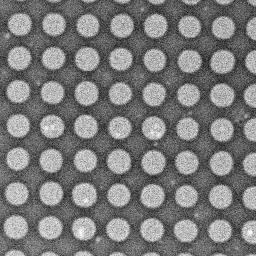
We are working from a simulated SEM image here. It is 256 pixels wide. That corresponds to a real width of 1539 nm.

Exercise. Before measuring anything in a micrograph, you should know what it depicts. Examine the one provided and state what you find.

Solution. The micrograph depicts an array of small figures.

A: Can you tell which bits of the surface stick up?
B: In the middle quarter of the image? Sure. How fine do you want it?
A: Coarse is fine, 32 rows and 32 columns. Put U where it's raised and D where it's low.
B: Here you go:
DDDUUUUUDDDDUUUUDDDDDUUUUDDDDUUU
DDDDDUUDDDDDDDDDDDDDDDUUDDDDDDUU
DDDDDDDDDDDDDDDDDDDDDDDDDDDDDDDD
DDDDDDDDDDDDDDDDDDDDDDDDDDDDDDDD
DDDDDDDDDDDDDDDDDDDDDDDDDDDDDDDD
DDDDUUUUDDDDUUUUDDDDDUUUDDDDDDUU
DDDUUUUUDDDDUUUUUDDDUUUUUDDDDUUU
DDDUUUUUDDDUUUUUUDDDUUUUUDDDDUUU
DDDUUUUUDDDDUUUUDDDDUUUUUDDDDUUU
DDDDUUUUDDDDUUUUDDDDDUUUDDDDDUUU
DDDDDDDDDDDDDDDDDDDDDDDDDDDDDDDD
DDDDDDDDDDDDDDDDDDDDDDDDDDDDDDDD
DDDDDDDDDDDDDDDDDDDDDDDDDDDDDDDD
DDDDUUUDDDDDDUDDDDDDDDUDDDDDDDDD
DDDUUUUUDDDDUUUUDDDDUUUUUDDDDUUU
DDDUUUUUDDDUUUUUUDDDUUUUUDDDUUUU
DDDUUUUUDDDUUUUUUDDDUUUUUDDDUUUU
DDDUUUUUDDDDUUUUDDDDUUUUUDDDDUUU
DDDDDDDDDDDDDUUDDDDDDUUUDDDDDDUU
DDDDDDDDDDDDDDDDDDDDDDDDDDDDDDDD
DDDDDDDDDDDDDDDDDDDDDDDDDDDDDDDD
DDDDDDDDDDDDDDDDDDDDDDDDDDDDDDDD
DDDUUUUDDDDDUUUUDDDDDUUUDDDDDUUU
DDDUUUUUDDDUUUUUDDDDUUUUUDDDUUUU
DDDUUUUUDDDUUUUUUDDDUUUUUDDDUUUU
DDDUUUUUDDDUUUUUDDDDUUUUUDDDUUUU
DDDDUUUDDDDDUUUUDDDDUUUUUDDDDUUU
DDDDDDDDDDDDDDDDDDDDDDDDDDDDDDDD
DDDDDDDDDDDDDDDDDDDDDDDDDDDDDDDD
DDDDDDDDDDDDDDDDDDDDDDDDDDDDDDDD
DDDUUUUDDDDDUUUDDDDDDUUDDDDDDDDD
DDDUUUUUDDDUUUUUDDDDUUUUDDDDDUUU